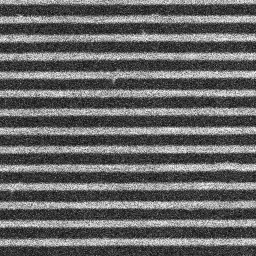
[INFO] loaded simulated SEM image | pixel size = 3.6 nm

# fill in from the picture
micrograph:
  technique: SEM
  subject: parallel lines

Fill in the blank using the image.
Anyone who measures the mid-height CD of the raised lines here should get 23.9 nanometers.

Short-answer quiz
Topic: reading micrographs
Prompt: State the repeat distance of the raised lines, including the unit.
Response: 66.8 nm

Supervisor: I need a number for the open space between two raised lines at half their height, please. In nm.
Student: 44.1